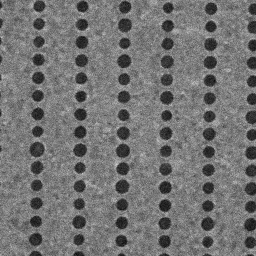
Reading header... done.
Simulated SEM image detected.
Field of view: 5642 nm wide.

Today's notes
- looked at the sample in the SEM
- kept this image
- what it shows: a regular array of holes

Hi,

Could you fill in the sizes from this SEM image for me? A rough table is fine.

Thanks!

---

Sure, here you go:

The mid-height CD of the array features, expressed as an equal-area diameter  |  282 nanometers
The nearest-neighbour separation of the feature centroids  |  393 nm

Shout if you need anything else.